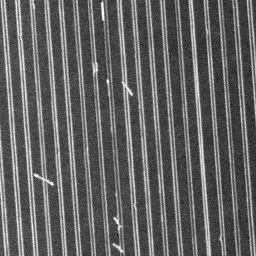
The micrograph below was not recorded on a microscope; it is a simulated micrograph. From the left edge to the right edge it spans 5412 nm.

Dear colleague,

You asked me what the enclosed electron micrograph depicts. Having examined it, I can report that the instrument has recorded parallel lines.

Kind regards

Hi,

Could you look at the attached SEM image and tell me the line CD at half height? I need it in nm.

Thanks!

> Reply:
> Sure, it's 68.5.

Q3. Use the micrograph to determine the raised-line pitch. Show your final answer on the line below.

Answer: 305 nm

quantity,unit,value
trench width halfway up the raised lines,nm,234